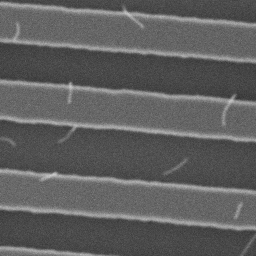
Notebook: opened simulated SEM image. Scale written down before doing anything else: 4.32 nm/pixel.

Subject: lines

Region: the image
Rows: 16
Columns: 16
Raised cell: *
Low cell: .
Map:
****............
****************
****************
...........*****
................
******..........
****************
.***************
............****
................
................
***********.....
****************
.....***********
................
**..............